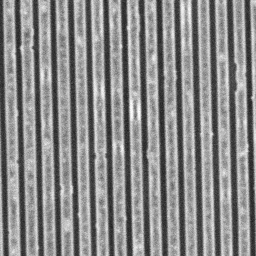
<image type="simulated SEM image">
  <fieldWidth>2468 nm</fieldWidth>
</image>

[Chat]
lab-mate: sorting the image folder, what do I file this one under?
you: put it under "parallel lines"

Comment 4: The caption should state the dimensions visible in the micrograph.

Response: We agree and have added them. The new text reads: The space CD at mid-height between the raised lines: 0.0711 um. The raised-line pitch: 171 nanometers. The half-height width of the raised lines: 98.8 nanometres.